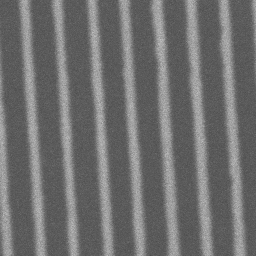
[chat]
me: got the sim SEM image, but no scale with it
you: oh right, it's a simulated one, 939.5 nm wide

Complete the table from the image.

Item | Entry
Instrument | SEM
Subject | parallel lines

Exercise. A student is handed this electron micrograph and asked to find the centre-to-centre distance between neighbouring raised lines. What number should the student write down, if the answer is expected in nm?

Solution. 122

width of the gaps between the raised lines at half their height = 93.3 nm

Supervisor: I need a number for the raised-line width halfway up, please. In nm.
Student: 27.9